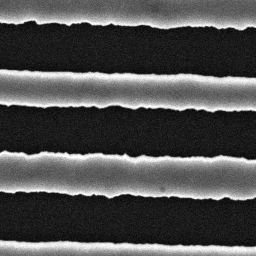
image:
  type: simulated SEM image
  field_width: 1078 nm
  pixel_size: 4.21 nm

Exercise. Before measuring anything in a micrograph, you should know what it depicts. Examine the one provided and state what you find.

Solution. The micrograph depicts lines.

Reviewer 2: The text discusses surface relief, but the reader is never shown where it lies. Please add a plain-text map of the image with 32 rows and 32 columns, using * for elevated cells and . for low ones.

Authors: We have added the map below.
********************************
********************************
********************************
....................**.....*.**.
................................
................................
................................
................................
................................
*************************.......
********************************
********************************
********************************
................*..*.***********
................................
................................
................................
................................
................................
****************...........*....
********************************
********************************
********************************
********************************
.............**...**************
................................
................................
................................
................................
................................
*****************..*............
********************************